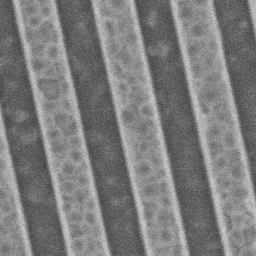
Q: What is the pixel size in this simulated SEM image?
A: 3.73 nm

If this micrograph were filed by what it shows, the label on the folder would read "one or a few lines or trenches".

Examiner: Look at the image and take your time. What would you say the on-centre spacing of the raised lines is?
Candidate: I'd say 76.1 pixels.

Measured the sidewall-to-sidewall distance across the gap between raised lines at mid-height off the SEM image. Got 150 nanometers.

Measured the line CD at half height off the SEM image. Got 0.137 micrometres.